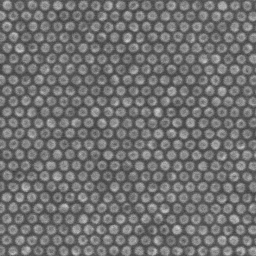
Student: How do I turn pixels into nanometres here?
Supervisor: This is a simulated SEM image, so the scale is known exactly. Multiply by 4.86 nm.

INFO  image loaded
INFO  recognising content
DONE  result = a regular array of raised bodies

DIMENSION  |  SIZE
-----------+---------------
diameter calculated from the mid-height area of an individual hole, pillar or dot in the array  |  42.8 nm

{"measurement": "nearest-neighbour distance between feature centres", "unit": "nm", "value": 58.4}